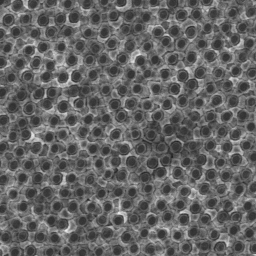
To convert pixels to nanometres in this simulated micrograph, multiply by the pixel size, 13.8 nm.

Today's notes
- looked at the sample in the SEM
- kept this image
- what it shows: a regular array of raised bodies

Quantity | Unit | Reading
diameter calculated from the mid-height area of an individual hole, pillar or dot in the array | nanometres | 130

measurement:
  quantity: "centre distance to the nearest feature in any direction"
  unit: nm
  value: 134